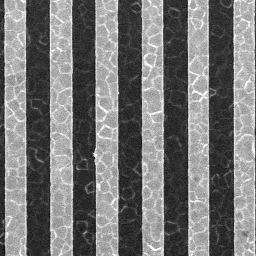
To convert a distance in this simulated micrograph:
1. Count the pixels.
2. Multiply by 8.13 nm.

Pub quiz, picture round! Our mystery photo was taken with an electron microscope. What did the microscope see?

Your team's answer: parallel lines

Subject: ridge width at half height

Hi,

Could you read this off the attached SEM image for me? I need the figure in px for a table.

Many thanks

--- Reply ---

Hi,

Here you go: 20.9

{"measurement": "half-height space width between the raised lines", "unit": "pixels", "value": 24.8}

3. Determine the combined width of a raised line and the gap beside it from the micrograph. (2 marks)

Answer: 372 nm